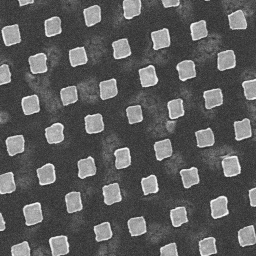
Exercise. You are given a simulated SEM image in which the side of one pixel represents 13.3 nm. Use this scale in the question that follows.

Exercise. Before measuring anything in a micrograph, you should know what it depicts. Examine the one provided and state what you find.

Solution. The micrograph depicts a regular array of raised bodies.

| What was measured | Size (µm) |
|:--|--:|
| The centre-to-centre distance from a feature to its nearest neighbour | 0.516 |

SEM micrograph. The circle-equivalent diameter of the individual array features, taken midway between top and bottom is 252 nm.